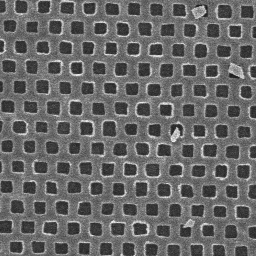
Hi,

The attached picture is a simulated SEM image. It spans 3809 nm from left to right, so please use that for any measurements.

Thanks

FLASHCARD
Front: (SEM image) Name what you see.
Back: a regular array of holes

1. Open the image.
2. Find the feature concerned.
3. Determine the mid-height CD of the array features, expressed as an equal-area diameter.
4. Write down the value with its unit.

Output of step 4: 207 nm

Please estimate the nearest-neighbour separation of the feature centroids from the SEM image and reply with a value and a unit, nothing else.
330 nm